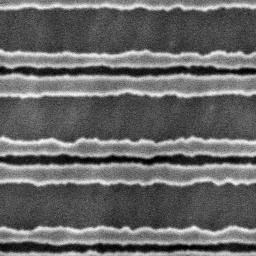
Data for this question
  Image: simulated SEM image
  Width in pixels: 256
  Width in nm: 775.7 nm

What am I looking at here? lines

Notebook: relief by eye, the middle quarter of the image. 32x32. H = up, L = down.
HHHHHHLLLLLHHHHHHHHHHHHHHHHLLLHH
LLLLLLLLLLLLLLLLLLLLLLLLLLLLLLLL
LLLLLLLLLLLLLLLLLLLLLLLLLLLLLLLL
HHHHHHHHHHHHHHHHHHHHHHHHHHHHHHHH
HHHHHHHHHHHHHHHHHHHHHHHHHHHHHHHH
HHHHHHHHHHHHHHHHHHHHHHHHHHHHHHHH
HHHHHHHHHHHHHHHHHHHHHHHHHHHHHHHH
HHHHHHHHHHHHHHLLLLLHHHHHHHLLHHHH
LLLLLLLLLLLLLLLLLLLLLLLLLLLLLLLL
LLLLLLLLLLLLLLLLLLLLLLLLLLLLLLLL
LLLLLLLLLLLLLLLLLLLLLLLLLLLLLLLL
LLLLLLLLLLLLLLLLLLLLLLLLLLLLLLLL
LLLLLLLLLLLLLLLLLLLLLLLLLLLLLLLL
LLLLLLLLLLLLLLLLLLLLLLLLLLLLLLLL
LLLLLLLLLLLLLLLLLLLLLLLLLLLLLLLL
LLLLLLLLLLLLLLLLLLLLLLLLLLLLLLLL
LLLLLLLLLLLLLLLLLLLLLLLLLLLLLLLL
LLLLLLLLLLLLLLLLLLLLLLLLLLLLLLLL
LLLLHLLLLLLLLLLLLLLLLLLLLLLLLLLL
LLLHHHHHHHHHHHHHHLHHHHLLLHHHHHHH
HHHHHHHHHHHHHHHHHHHHHHHHHHHHHHHH
HHHHHHHHHHHHHHHHHHHHHHHHHHHHHHHH
HHHHHHHHHHHHHHHHHHHHHHHHHHHHLHHH
LLLLLLLLLLLLLLLLLLLLLLLLLLLLLLLL
LLLLLLLLLLLLLLLLLLLLLLLLLLLLLLLL
HHHHHHHHHHHHHHHHHHHHHHHHHHHHHHLH
HHHHHHHHHHHHHHHHHHHHHHHHHHHHHHHH
HHHHHHHHHHHHHHHHHHHHHHHHHHHHHHHH
HHHHHHHHHHHHHHHHHHHHHHHHHHHHHHHH
HLHHHHHHLHHHHHHHHHHHHHLLHHHHHHHH
LLLLLLLLLLLLLLLLLLLLLLLLLLLLLLLL
LLLLLLLLLLLLLLLLLLLLLLLLLLLLLLLL